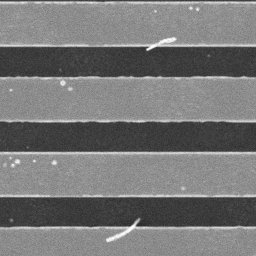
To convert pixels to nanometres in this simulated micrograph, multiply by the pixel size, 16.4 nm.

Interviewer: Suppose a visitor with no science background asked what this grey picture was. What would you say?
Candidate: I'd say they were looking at lines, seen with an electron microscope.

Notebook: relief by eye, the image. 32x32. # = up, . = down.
################################
################################
################################
################################
################################
################################
................................
................................
................................
................................
################################
################################
################################
################################
################################
................................
................................
................................
................................
################################
################################
################################
################################
################################
################################
................................
................................
................................
.###############################
################################
################################
################################